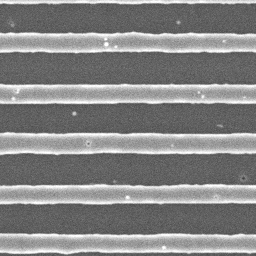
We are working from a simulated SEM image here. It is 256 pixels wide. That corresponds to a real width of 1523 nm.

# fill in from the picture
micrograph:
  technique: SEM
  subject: lines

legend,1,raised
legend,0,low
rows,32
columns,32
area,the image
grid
00000000000000000000000000000000
00000000000000000000000000000000
00000000000000000000000000000000
00000000000000000000000000000000
11111111111111111111111111111111
11111111111111111111111111111111
00000000000000000000000000000000
00000000000000000000000000000000
00000000000000000000000000000000
00000000000000000000000000000000
00000000000000000000000000000000
11111111111111111111111111111111
11111111111111111111111111111111
00000000000000000000000000000000
00000000000000000000000000000000
00000000000000000000000000000000
00000000000000000000000000000000
11111111111111111111111111111111
11111111111111111111111111111111
00000000000000000000000000000000
00000000000000000000000000000000
00000000000000000000000000000000
00000000000000000000000000000000
11111111111111111111111111111111
11111111111111111111111111111111
00000000000000000000000000000000
00000000000000000000000000000000
00000000000000000000000000000000
00000000000000000000000000000000
11111111111111111111111111111111
11111111111111111111111111111111
01111001100000000000000000000000